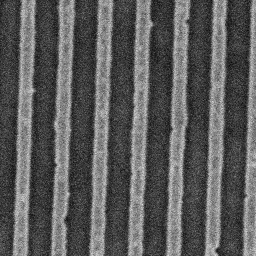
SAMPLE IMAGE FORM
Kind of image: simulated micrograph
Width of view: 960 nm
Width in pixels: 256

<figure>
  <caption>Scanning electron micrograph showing parallel lines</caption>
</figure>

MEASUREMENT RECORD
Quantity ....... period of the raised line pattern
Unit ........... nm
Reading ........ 144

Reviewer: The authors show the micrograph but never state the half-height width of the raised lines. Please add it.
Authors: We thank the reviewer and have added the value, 45.5 nanometers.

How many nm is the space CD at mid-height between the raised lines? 98.5